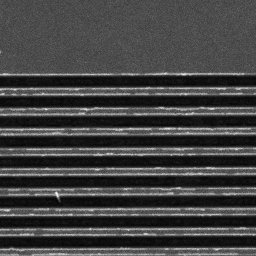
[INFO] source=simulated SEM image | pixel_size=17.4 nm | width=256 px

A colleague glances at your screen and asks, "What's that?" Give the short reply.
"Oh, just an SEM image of parallel lines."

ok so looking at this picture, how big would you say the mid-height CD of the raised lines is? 9 pixels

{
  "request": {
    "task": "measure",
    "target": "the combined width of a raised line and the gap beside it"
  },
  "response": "350 nm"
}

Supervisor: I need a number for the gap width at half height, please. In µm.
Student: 0.187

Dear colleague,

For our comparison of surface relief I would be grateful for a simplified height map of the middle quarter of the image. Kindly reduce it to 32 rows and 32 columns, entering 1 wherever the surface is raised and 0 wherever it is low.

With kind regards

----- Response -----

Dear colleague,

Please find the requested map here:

11111111111111111111111111111111
11111111111111111111111111111111
11111111111111111111111111111111
00000000000000000000000000000000
00000000000000000000000000000000
00000000000000000000000000000000
11111111111111111111111111111111
11111111111111111111111111111111
00000000000000000000000000000000
00000000000000000000000000000000
00000000000000000000000000000000
11111111111111111111111111111111
11111111111111111111111111111111
00000000000000000000000000000000
00000000000000000000000000000000
00000000000000000000000000000000
11111111111111111111111111111111
11111111111111111111111111111111
00000000000000000000000000000000
00000000000000000000000000000000
00000000000000000000000000000000
11111111111111111111111111111111
11111111111111111111111111111111
00000000000000000000000000000000
00000000000000000000000000000000
00000000000000000000000000000000
11111111111111111111111111111111
11111111111111111111111111111111
00000000000000000000000000000000
00000000000000000000000000000000
00000000000000000000000000000000
11111111111111111111111111111111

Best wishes